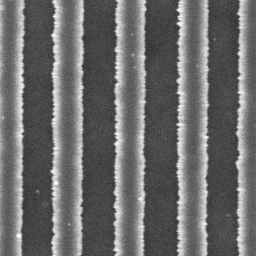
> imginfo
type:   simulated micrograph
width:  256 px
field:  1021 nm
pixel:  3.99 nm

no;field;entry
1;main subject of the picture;lines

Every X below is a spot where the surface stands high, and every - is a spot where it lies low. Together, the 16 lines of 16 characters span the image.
X--XX--XX--XX--X
X--XX--XX--XX--X
X--XX--XX--XX--X
X--XX--XX--XX--X
X--XX--XX--XX--X
X--XX--XX--XX--X
X--XX--XX--XX--X
X--XX--XX--XX--X
X--XX--XX--XX--X
X--XX--XX--XX--X
X--XX--XX--XX--X
X--XX--XX--XX--X
X--XX--XX--XX--X
X--XX--XX--XX--X
X--XX--XX--XX--X
X--XX--XX--XX--X